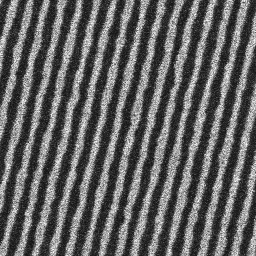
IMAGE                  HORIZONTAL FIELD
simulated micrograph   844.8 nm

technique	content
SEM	parallel lines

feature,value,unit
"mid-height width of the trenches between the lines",0.0285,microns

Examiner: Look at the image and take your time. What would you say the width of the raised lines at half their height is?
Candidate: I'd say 6.94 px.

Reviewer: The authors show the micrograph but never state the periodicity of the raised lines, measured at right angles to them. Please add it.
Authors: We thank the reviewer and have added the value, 53.1 nm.